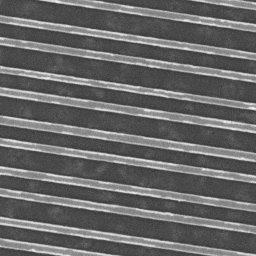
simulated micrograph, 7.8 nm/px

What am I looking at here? parallel lines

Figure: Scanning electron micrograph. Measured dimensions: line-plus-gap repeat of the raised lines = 25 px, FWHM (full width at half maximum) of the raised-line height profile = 0.0521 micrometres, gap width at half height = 155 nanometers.